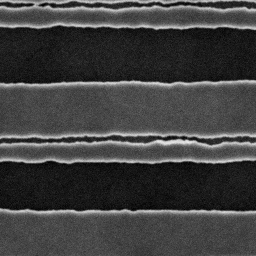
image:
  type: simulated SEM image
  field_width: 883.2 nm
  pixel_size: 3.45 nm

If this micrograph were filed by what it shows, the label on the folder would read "lines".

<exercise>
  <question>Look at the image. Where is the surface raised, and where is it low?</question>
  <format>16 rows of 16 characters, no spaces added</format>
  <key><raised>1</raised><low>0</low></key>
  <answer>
1111111111111111
1111111111111111
0000000000000000
0000000000000000
0000000000000000
1111111111111111
1111111111111111
1111111111111111
1111111111111111
1111111111111111
0000000000000000
0000000000000000
0000000000000000
1111111111111111
1111111111111111
1111111111111111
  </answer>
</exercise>